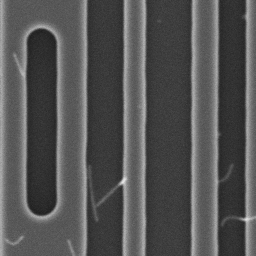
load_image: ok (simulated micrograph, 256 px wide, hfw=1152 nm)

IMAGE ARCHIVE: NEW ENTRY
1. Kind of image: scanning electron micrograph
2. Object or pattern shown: groups of lines, slits or small figures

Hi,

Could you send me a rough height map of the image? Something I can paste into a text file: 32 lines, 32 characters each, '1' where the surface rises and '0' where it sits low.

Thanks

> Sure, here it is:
11111111111000001100000011100001
11111111111000001100000011100001
11111111111000001100000011100001
11111111111000001100000011100001
11110001111000001100000011100001
11100001111000001100000011100001
11100001111000001100000011100001
11100001111000001100000011100001
11100001111000001100000011100001
11100001111000001100000011100001
11100001111000001100000011100001
11100001111000001100000011100001
11100001111000001100000011100001
11100001111000001100000011100001
11100001111000001100000011100001
11100001111000001100000011100001
11100001111000001100000011100001
11100001111000001100000011100001
11100001111000001100000011100001
11100001111000001100000011100001
11100001111000011100000011100001
11100001111000011100000011100001
11100001111000011100000011100001
11100001111000011100000011100001
11100001111000001100000011100001
11100001111000001100000011100001
11110011111000001100000011100001
11111111111000011100000011100001
11111111111000011100000011100001
11111111111000011100000011100001
11111111111000011100000011100001
11111111111000011100000011100001